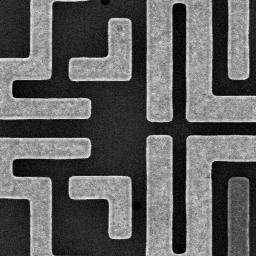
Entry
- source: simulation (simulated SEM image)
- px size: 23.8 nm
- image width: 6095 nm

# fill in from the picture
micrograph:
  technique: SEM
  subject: wiring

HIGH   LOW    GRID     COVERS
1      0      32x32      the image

00001110000000000011110111000110
00001100000000000011100111000110
00001100000000110011100111000110
00001100000000110011100111000110
00001100000000110011100111100110
00001100000000110011100111100110
00001100000000110011100111100110
11111100011111110011110111100110
11111100011111110011110111000110
11111100011111110011100111000110
11000000000000000011100111000000
11000000000000000011100111100000
11111111111000000011100111111111
11111111111000000011110111111111
11111111111000000011110111111111
00000000000000000000000000000000
00000000000000000000000000000000
11111111111000000011100111111111
11111111111000000011100111111111
11111111111000000011100111111111
11000000000000000011100111100000
11000000000000000011100111000000
11111100011111110011100111000110
11111100011111110011100111000110
11111100011111110011110111000110
00001100000000110011110111000110
00001100000000110011110111000110
00001100000000110011100111000110
00001100000000110011100111000110
00001100000000110011100111000110
00001100000000000011100111000110
00001100000000000011110111000110